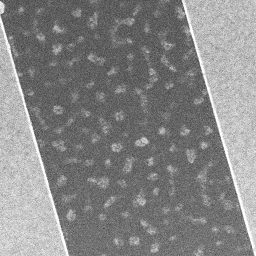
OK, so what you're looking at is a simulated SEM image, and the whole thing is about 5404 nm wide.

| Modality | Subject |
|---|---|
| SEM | one or a few lines or trenches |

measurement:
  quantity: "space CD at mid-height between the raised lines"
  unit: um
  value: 3.82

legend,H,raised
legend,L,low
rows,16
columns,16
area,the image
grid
LLLLLLLLLLLLHHHH
LLLLLLLLLLLLHHHH
LLLLLLLLLLLLHHHH
HLLLLLLLLLLLHHHH
HLLLLLLLLLLLLHHH
HLLLLLLLLLLLLHHH
HHLLLLLLLLLLLHHH
HHLLLLLLLLLLLLHH
HHLLLLLLLLLLLLHH
HHLLLLLLLLLLLLHH
HHHLLLLLLLLLLLHH
HHHLLLLLLLLLLLLH
HHHLLLLLLLLLLLLH
HHHHLLLLLLLLLLLH
HHHHLLLLLLLLLLLL
HHHHLLLLLLLLLLLL